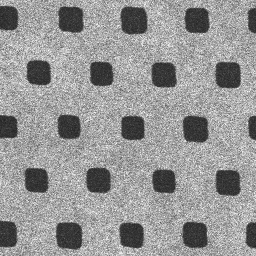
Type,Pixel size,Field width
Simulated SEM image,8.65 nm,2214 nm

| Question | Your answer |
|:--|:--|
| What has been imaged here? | a regular array of holes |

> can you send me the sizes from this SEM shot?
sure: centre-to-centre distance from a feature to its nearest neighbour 537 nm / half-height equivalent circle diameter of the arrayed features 234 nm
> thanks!